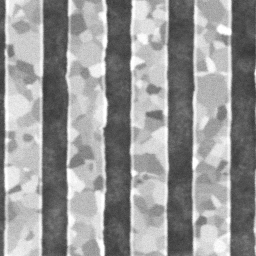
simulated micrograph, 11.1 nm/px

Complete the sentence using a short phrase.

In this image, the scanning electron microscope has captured one or a few lines or trenches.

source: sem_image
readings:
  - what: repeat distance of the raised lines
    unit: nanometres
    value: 699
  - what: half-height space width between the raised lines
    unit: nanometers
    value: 315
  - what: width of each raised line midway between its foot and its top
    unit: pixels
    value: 33.8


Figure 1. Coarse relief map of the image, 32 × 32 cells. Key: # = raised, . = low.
.####....####....####...#####...
.####....####....####...#####...
.####....####....####...#####...
.####....####...#####....####...
.####....####....####...#####...
.####....####....####...#####...
.####...#####....####...#####...
.####...#####....####...#####...
.####....####....####...#####...
.####...#####....####...#####...
.####....####....####....####...
.####....####....####...#####...
.####....####....####...#####...
.####....####....####...#####...
.####....####....####...#####...
.####....####....####...#####...
.####....####....####...#####...
.####....####....####...#####...
.####....####....####...#####...
.####....####....####...#####...
.####....####....####...#####...
.####....####....####...#####...
.####....####....####...#####...
.####....####...#####...#####...
.####....####...#####...#####...
.####....####...#####...#####...
.####....####....####...#####...
.####....####....####...#####...
.####....####....####...#####...
.####....####...#####...#####...
.####....####...#####...#####...
.####....####....####...#####...